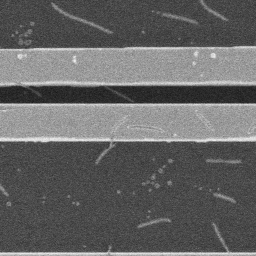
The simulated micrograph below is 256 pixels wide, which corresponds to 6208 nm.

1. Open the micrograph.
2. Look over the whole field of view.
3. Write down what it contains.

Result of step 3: lines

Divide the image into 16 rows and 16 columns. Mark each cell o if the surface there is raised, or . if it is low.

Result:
................
................
................
oooooooooooooooo
oooooooooooooooo
................
................
oooooooooooooooo
oooooooooooooooo
................
................
................
................
................
................
................